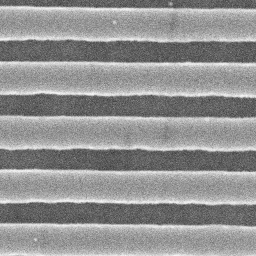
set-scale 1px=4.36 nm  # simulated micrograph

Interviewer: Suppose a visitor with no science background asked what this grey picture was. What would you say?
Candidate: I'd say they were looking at lines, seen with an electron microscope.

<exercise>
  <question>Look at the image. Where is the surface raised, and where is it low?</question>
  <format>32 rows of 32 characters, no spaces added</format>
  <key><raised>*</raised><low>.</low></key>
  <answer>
................................
********************************
********************************
********************************
********************************
................................
................................
................................
********************************
********************************
********************************
********************************
................................
................................
................................
********************************
********************************
********************************
.*.....*....**....**************
................................
................................
*************.....*.............
********************************
********************************
********************************
................................
................................
................................
*******************************.
********************************
********************************
********************************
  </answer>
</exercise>